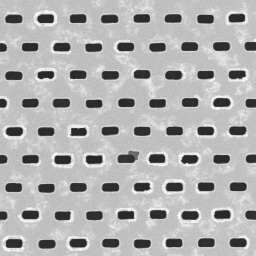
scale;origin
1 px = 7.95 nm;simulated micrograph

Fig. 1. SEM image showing a regular array of holes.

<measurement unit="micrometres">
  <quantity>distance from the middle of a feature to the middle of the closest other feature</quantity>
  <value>0.25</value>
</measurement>